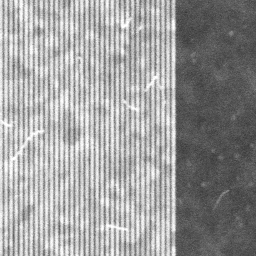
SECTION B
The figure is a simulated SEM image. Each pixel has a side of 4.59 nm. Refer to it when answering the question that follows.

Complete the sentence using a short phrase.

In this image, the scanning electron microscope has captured parallel lines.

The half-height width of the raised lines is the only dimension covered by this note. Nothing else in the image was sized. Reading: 16.6 nm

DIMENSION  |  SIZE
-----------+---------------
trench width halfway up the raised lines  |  6.9 nanometres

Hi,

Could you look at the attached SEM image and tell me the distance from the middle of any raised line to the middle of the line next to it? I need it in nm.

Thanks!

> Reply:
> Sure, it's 23.2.